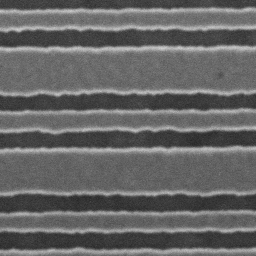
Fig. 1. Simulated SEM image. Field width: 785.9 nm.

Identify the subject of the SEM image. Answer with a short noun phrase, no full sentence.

lines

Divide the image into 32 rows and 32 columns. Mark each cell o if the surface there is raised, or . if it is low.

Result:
................................
oooooooooooooooooooooooooooooooo
oooooooooooooooooooooooooooooooo
oooooooooooooooo.ooooooooooooooo
................................
................................
oooooooooooooooooooooooooooooooo
oooooooooooooooooooooooooooooooo
oooooooooooooooooooooooooooooooo
oooooooooooooooooooooooooooooooo
oooooooooooooooooooooooooooooooo
oooooooooooooooooooooooooooooooo
................................
................................
oooooooooooooooooooooooooooooooo
oooooooooooooooooooooooooooooooo
......oo........................
................................
.........................oo.oooo
oooooooooooooooooooooooooooooooo
oooooooooooooooooooooooooooooooo
oooooooooooooooooooooooooooooooo
oooooooooooooooooooooooooooooooo
oooooooooooooooooooooooooooooooo
................................
................................
......ooo..ooo.o......oo.ooooooo
oooooooooooooooooooooooooooooooo
oooooooooooooooooooooooooooooooo
................................
................................
oooooooooooooooooooooooooooooooo